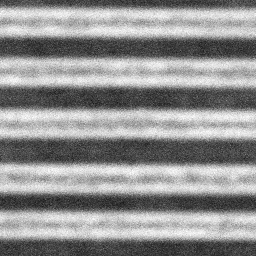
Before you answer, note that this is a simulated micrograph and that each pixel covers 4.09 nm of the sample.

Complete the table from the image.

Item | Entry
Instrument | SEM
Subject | parallel lines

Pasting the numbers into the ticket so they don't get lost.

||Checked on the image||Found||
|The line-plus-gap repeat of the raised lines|207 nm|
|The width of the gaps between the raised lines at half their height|120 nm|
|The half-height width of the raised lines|84.9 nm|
